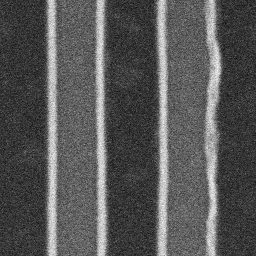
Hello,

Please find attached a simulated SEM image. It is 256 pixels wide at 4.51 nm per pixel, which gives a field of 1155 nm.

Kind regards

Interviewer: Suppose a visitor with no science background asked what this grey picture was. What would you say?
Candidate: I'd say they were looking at one or a few lines or trenches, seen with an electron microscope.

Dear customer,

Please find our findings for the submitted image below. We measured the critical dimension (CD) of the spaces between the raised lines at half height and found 218 nm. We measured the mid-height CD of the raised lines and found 281 nm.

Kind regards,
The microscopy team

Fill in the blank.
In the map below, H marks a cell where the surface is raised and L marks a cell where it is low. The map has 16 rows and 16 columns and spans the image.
HHHLLLHHHHLLLHHH
HHHLLLHHHHLLLHHH
HHHLLLHHHHLLLHHH
HHHLLLHHHHLLLHHH
HHHLLLHHHHLLLHHH
HHHLLLHHHHLLLHHH
HHHLLLHHHHLLLHHH
HHHLLLHHHHLLLHHH
HHHLLLHHHHLLLHHH
HHHLLLHHHHLLLHHH
HHHLLLHHHHLLLHHH
HHHLLLHHHHLLLHHH
HHHLLLHHHHLLLHHH
HHHLLLHHHHLLLHHH
HHHLLLHHHHLLLHHH
HHHLLLHHHHLLLHHH